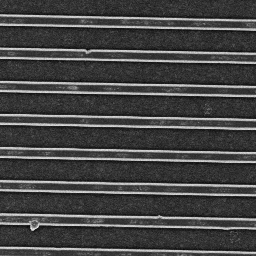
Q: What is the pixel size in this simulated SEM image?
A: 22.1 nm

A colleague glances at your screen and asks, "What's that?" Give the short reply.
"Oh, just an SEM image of parallel lines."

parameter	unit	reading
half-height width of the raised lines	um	0.208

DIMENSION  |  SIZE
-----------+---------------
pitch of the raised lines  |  33.2 px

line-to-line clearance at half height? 529 nm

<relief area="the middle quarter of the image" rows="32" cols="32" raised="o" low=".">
................................
................................
................................
................................
................................
oooooooooooooooooooooooooooooooo
oooooooooooooooooooooooooooooooo
...............................o
................................
................................
................................
................................
................................
oooooooooooooooooooo............
oooooooooooooooooooooooooooooooo
..............oooooooooooooooooo
................................
................................
................................
................................
................................
oooo............................
oooooooooooooooooooooooooooooooo
oooooooooooooooooooooooooooooooo
................................
................................
................................
................................
................................
................................
oooooooooooooooooooooooooooooooo
oooooooooooooooooooooooooooooooo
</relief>